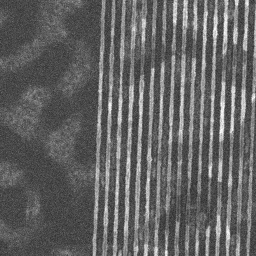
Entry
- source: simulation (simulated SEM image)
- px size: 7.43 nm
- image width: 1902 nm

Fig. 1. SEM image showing parallel lines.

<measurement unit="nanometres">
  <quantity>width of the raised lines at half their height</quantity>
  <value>22.3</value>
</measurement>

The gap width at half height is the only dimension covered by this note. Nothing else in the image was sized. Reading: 55.7 nm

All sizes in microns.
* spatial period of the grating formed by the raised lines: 0.076